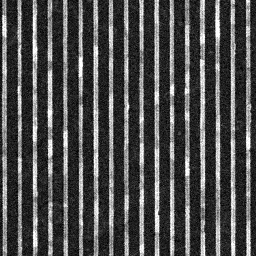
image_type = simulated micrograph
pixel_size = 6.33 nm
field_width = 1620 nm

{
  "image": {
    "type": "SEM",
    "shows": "parallel lines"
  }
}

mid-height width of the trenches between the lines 0.0744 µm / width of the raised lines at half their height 0.019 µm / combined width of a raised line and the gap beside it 0.0964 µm